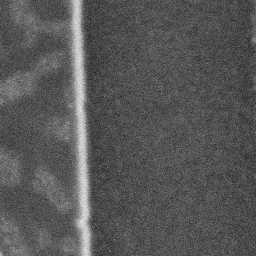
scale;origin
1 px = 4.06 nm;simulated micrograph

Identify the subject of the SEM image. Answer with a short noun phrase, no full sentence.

one or a few lines or trenches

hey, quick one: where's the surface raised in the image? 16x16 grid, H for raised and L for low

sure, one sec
HHHHHLLLLLLLLLLL
HHHHHLLLLLLLLLLL
HHHHHLLLLLLLLLLL
HHHHHLLLLLLLLLLL
HHHHHLLLLLLLLLLL
HHHHHLLLLLLLLLLL
HHHHHLLLLLLLLLLL
HHHHHLLLLLLLLLLL
HHHHHLLLLLLLLLLL
HHHHHLLLLLLLLLLL
HHHHHLLLLLLLLLLL
HHHHHLLLLLLLLLLL
HHHHHLLLLLLLLLLL
HHHHHLLLLLLLLLLL
HHHHHLLLLLLLLLLL
HHHHHLLLLLLLLLLL